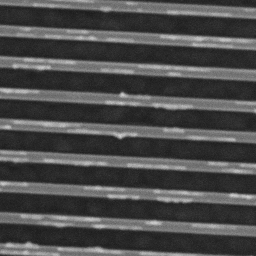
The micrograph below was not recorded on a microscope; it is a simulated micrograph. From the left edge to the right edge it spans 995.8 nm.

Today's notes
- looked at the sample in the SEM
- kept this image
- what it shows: parallel lines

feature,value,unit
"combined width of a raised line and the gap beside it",121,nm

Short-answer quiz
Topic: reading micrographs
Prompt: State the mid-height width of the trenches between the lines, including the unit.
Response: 82.6 nm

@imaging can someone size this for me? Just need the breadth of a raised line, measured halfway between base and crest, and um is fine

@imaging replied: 0.0374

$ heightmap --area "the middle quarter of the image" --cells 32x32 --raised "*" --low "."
**********************..........
********************************
...............*...*************
................................
................................
................................
................................
*********.....**................
****************************....
.....***************************
......................**********
................................
................................
................................
................................
**************..................
********************************
...........*********************
..............*..............***
................................
................................
................................
*...............................
***************...*.............
********************************
............********************
..............................**
................................
................................
................................
**..............................
*********************..*........